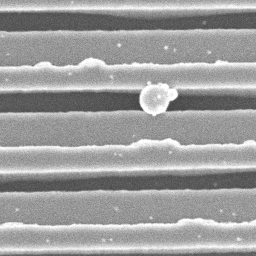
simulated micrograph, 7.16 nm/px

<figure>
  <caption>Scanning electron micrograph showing lines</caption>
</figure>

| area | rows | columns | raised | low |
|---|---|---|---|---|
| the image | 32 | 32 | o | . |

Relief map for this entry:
oooooooooooooooooooooooooooooooo
................................
................................
................................
oooooooooooooooooooooooooooooooo
oooooooooooooooooooooooooooooooo
oooooooooooooooooooooooooooooooo
oooooooooooooooooooooooooooooooo
oooooooooooooooooooooooooooooooo
oooooooooooooooooooooooooooooooo
oooooooooooooooooooooooooooooooo
..................oooo..........
..................oooo..........
..................ooo...........
oooooooooooooooooooooooooooooooo
oooooooooooooooooooooooooooooooo
oooooooooooooooooooooooooooooooo
oooooooooooooooooooooooooooooooo
oooooooooooooooooooooooooooooooo
oooooooooooooooooooooooooooooooo
oooooooooooooooooooooooooooooooo
oooooooooo......................
................................
................................
oooooooooooooooooooooooooooooooo
oooooooooooooooooooooooooooooooo
oooooooooooooooooooooooooooooooo
oooooooooooooooooooooooooooooooo
oooooooooooooooooooooooooooooooo
oooooooooooooooooooooooooooooooo
oooooooooooooooooooooooooooooooo
................................